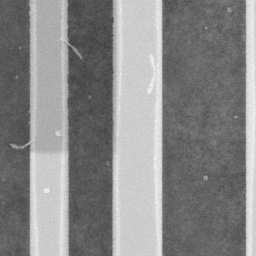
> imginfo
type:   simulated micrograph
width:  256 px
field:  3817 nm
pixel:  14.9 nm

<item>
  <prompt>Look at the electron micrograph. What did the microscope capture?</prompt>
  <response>lines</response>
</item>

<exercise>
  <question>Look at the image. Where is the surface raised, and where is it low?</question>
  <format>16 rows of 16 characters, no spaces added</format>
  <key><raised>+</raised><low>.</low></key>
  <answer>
..++...+++......
..++...+++......
..++...+++......
..++...+++......
..++...+++......
..++...+++......
..++...+++......
..++...+++......
..++...+++......
..++...+++......
..++...+++......
..++...+++......
..++...+++......
..++...+++......
..++...+++......
..++...+++.....+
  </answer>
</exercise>